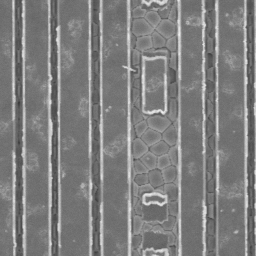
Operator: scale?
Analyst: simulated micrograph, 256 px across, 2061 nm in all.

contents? parallel lines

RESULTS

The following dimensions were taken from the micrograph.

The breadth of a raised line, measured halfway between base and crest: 238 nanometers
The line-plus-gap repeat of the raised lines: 314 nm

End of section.